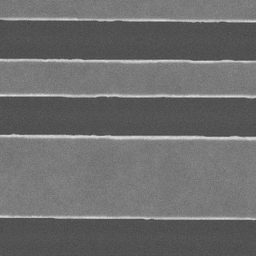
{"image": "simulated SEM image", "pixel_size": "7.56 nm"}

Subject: lines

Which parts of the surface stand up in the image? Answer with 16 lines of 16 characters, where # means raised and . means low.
################
................
................
................
################
################
................
................
######..........
################
################
################
################
################
................
................